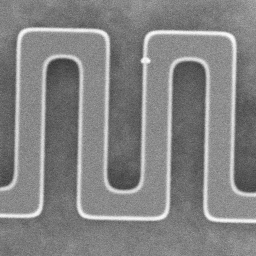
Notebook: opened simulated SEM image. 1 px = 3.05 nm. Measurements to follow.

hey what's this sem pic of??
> groups of lines, slits or small figures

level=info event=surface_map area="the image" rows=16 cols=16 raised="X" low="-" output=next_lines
----------------
----------------
-XXXXXX--XXXXXX-
-XXXXXX--XXXXXX-
-XX--XX--XX--XX-
-XX--XX--XX--XX-
-XX--XX--XX--XX-
-XX--XX--XX--XX-
-XX--XX--XX--XX-
-XX--XX--XX--XX-
-XX--XX--XX--XX-
-XX--XX--XX--XX-
XXX--XXXXXX--XXX
-----XXXXX---XXX
----------------
----------------